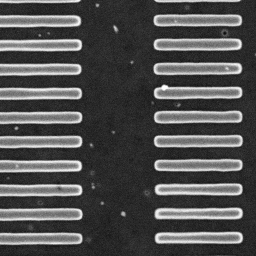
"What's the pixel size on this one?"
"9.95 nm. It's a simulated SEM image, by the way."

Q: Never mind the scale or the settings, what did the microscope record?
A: groups of lines, slits or small figures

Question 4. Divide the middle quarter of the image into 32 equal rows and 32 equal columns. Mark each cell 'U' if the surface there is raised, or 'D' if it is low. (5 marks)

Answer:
UUUUDDDDDDDDDDDDDDDDDDDUUUUUUUUU
UUUUDDDDDDDDDDDDDDDDDDDUUUUUUUUU
UUUDDDDDDDDDDDDDDDDDDDDUUUUUUUUU
DDDDDDDDDDDDDDDDDDDDDDDDDDDDDDDD
DDDDDDDDDDDDDDDDDDDDDDDDDDDDDDDD
DDDDDDDDDDDDDDDDDDDDDDDDDUDDDDDD
UUUUDDDDDDDDDDDDDDDDDDDUUUUUUUUU
UUUUDDDDDDDDDDDDDDDDDDDUUUUUUUUU
DUUUDDDDDDDDDDDDDDDDDDDDDDDUUDDD
DDDDDDDDDDDDDDDDDDDDDDDDDDDDDDDD
DDDDDDDDDDDDDDDDDDDDDDDDDDDDDDDD
DDDDDDDDDDDDDDDDDDDDDDDDDDDDDDDD
UUUUDDDDDDDDDDDDDDDDDDDUUUUUUUUU
UUUUDDDDDDDDDDDDDDDDDDDUUUUUUUUU
UUUUDDDDDDDDDDDDDDDDDDDUUUUUUUUU
DDDDDDDDDDDDDDDDDDDDDDDDDDDDDDDD
DDDDDDDDDDDDDDDDDDDDDDDDDDDDDDDD
DDDDDDDDDDDDDDDDDDDDDDDDDDDDDDDD
UUUUDDDDDDDDDDDDDDDDDDDUUUUUUUUU
UUUUDDDDDDDDDDDDDDDDDDDUUUUUUUUU
UUUUDDDDDDDDDDDDDDDDDDDUUUUUUUUU
DDDDDDDDDDDDDDDDDDDDDDDDDDDDDDDD
DDDDDDDDDDDDDDDDDDDDDDDDDDDDDDDD
DDDDDDDDDDDDDDDDDDDDDDDDDDDDDDDD
UUUUDDDDDDDDDDDDDDDDDDDUUUUUUUUU
UUUUDDDDDDDDDDDDDDDDDDDUUUUUUUUU
UUUDDDDDDDDDDDDDDDDDDDDDDDDUUUUU
DDDDDDDDDDDDDDDDDDDDDDDDDDDDDDDD
DDDDDDDDDDDDDDDDDDDDDDDDDDDDDDDD
DDDDDDDDDDDDDDDDDDDDDDDDDDDDDDDD
UUUUDDDDDDDDDDDDDDDDDDDUUUUUUUUU
UUUUDDDDDDDDDDDDDDDDDDDUUUUUUUUU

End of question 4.